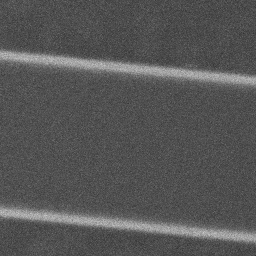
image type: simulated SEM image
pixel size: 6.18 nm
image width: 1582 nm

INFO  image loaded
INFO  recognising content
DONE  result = one or a few lines or trenches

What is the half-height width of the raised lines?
969 nm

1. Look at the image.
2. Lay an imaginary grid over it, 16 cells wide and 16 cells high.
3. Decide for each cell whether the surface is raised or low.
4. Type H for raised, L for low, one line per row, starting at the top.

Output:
LLLLLLLLLLLLLLLL
LLLLLLLLLLLLLLLL
LLLLLLLLLLLLLLLL
HLLLLLLLLLLLLLLL
HHHHHHHHHHHLLLLL
HHHHHHHHHHHHHHHH
HHHHHHHHHHHHHHHH
HHHHHHHHHHHHHHHH
HHHHHHHHHHHHHHHH
HHHHHHHHHHHHHHHH
HHHHHHHHHHHHHHHH
HHHHHHHHHHHHHHHH
HHHHHHHHHHHHHHHH
LLHHHHHHHHHHHHHH
LLLLLLLLLLLLHHHH
LLLLLLLLLLLLLLLL